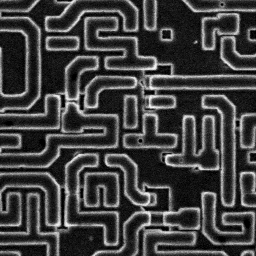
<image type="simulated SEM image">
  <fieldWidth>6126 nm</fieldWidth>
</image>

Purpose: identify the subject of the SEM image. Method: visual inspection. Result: wiring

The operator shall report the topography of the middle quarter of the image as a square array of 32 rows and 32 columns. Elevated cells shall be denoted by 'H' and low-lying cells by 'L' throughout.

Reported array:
LHHHHHHHLLHHHHHHHHHHHHHLLLLLLLLL
HHHHHLLLLLLLLLLLLLLLLLLLLLLLLLLL
HHHHLLLLLLLLLLLLLLLLLLLLLLLLLLLL
HHHHLLLLHHHHHHHHHHLLLLHHHHHHHHHH
HHHHLLLHHHHHHHHHHHLLLLHHHHHHHHHH
HHHHLLHHHHHHHHHHHHLLLLHHHHHHHHHH
HHHHLHHHHLLLLLLLLLLLLLLLLLLLLLLL
HHHHLHHHLLLLLLLLLLLLLLLLLLLLLLLL
LHHLLHHHLLLLLLLHHHLLLLHHHHHHLLLL
LLLLLHHHLLLLLLLHHHLLLHHHHHHHLLLL
LHHLLLHHLLLLLLLHHHLLLLHHHHHHLLLL
HHHHLLLLLLLLLLLHHHLLLLLLLLLLLLLL
HHHHHLLLLLLLLLLHHHLLLLLLLLLLLLLL
HHHHHHHHHHHHHLLHHHLLHHHLLLLLLLHH
HHHHHHHHHHHHHLLHHHLLHHHLLLLLLLHH
HHHHHHHHHHHHHLLHHHLLHHHLLLLLLLHH
HHHHHLLLLLHHHLLLLLLLHHHLLLLLLLHH
HHHHHLLLLLHHHLLLLLLHHHHHLLLLLLHH
HHHHHHHHHHHHHLLHHHHHHHHHHHHHLLHH
HHHHHHHHHHHHHLLHHHHHHHHHHHHHLLHH
HHHHHHHHHHHHHLLHHHHHHHHHHHHHLLHH
LLLLLLLLLLLLLLLLLLLLLLLLLLLLLLHH
LLLLLLLLLLLLLLLLLLLLLLLLLLLLLHHH
LLLHHHHHLLHHHHHHLLLLLLLLLLHHHHHH
LHHHHHHHLLHHHHHHHLLLLLLLLLHHHHHH
HHHHHHHHLLLLLHHHHHLLLLLLLLLLLLLL
HHHHLLLLLLLLLLLHHHLLLLLLLLLLLLLL
HHHHLLHHHHHHHLLHHHLLLLLLLLLLLLLL
HHHLLHHHHHHHHLLHHHLLLLLLLLLLLLLL
HHHLLHHHHHHHHLLHHHLLLLLLLLLLLLLL
HHHLLHHHHHHHHLLHHHLLLLLLLLLLLLLL
LHHLLHHHLLHHHLLHHHHLLLLLLLLLLLLL